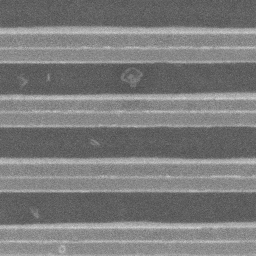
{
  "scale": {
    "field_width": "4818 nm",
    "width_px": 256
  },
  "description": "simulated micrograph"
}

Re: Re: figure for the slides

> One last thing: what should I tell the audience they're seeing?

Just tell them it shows lines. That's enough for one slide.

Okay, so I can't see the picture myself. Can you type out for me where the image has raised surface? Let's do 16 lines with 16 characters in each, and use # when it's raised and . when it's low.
................
................
################
################
................
................
################
################
................
................
################
################
................
................
################
################